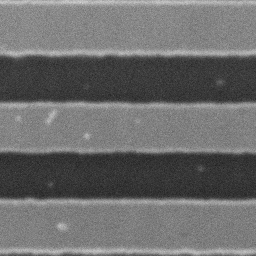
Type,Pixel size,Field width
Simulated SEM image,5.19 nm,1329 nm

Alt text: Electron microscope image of lines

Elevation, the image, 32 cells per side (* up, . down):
********************************
********************************
********************************
********************************
********************************
********************************
********************************
................................
................................
................................
................................
................................
................................
********************************
********************************
********************************
********************************
********************************
********************************
................................
................................
................................
................................
................................
................................
********************************
********************************
********************************
********************************
********************************
********************************
........................*.......